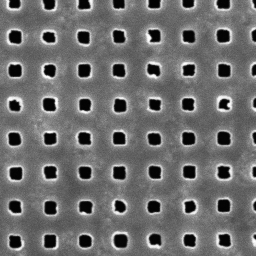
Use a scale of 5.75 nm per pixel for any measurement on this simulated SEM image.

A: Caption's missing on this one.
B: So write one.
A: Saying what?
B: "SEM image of a regular array of holes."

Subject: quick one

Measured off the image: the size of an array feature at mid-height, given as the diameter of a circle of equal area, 74.5 nm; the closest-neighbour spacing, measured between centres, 33.6 px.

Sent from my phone